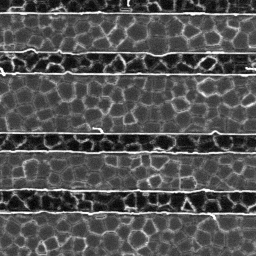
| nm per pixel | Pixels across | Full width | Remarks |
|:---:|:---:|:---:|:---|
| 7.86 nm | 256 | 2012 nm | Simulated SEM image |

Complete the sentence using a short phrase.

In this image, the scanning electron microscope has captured one or a few lines or trenches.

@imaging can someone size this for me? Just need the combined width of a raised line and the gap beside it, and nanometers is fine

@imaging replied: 545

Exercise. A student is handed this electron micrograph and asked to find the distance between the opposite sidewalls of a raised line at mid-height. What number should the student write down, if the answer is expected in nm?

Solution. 169